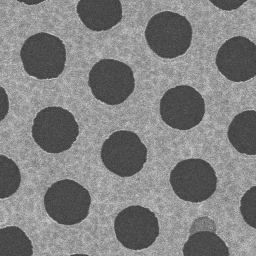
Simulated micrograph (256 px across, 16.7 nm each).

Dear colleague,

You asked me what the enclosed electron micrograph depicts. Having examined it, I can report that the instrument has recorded a regular array of holes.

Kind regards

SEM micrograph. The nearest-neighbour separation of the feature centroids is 1.23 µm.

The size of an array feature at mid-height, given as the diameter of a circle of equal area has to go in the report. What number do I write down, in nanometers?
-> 772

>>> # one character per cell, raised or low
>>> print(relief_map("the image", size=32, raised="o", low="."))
ooo..ooooo.....oooooooooooo...oo
oooooooooo.....ooooo..oooooooooo
oooooooooo.....oooo....ooooooooo
ooooooooooo...oooo......oooooooo
oooo...ooooooooooo......oooooooo
ooo.....oooooooooo......oooo....
ooo.....ooooooooooo....oooo.....
ooo.....ooooo..oooooooooooo.....
ooo.....ooo.....ooooooooooo.....
oooo...oooo......ooooooooooo....
ooooooooooo......ooooooooooooooo
.oooooooooo......oooo....ooooooo
.ooooooooooo....oooo.....ooooooo
.ooooo..oooooooooooo......oooooo
.ooo.....ooooooooooo.....oooo...
oooo......ooooooooooo....oooo...
oooo......oooo..oooooooooooo....
oooo.....oooo.....ooooooooooo...
ooooo....oooo.....ooooooooooo...
.oooooooooooo.....oooooooooooooo
..ooooooooooo.....oooo....oooooo
..oooooooooooo...oooo......ooooo
...ooooo.oooooooooooo......ooooo
..oooo.....oooooooooo......oooo.
.ooooo.....ooooooooooo....oooo..
oooooo.....ooooooooooooooooooo..
oooooo.....oooo....ooooooooooo..
ooooooo...oooo......ooooooooooo.
..oooooooooooo......oooooooooooo
...ooooooooooo......oooo...ooooo
....ooooooooooo....oooo.....oooo
....ooooooooooooooooooo......ooo